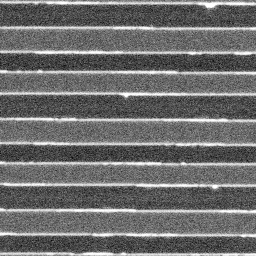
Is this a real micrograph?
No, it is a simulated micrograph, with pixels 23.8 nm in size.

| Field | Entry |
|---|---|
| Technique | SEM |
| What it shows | lines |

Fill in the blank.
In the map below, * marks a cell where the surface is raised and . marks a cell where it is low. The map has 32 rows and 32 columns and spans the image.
.........................**.....
................................
................................
*******************.............
********************************
********************************
....****************************
................................
................................
********************************
********************************
********************************
................................
................................
................................
********************************
********************************
********************************
................................
................................
********************..**........
********************************
********************************
................................
................................
................................
********************************
********************************
********************************
................................
................................
................................